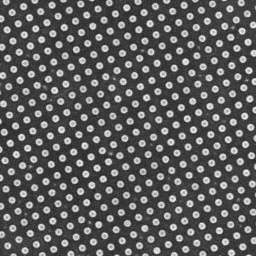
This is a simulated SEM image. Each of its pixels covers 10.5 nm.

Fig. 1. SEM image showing a regular array of raised bodies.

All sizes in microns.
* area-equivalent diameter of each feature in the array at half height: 0.067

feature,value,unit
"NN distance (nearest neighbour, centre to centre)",12.5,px